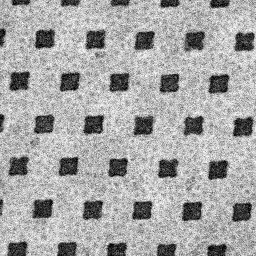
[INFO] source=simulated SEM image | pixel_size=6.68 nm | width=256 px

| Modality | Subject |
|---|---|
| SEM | a regular array of holes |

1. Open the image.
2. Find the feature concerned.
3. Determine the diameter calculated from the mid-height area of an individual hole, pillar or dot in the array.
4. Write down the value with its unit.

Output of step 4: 141 nanometers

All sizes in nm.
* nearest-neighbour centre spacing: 327